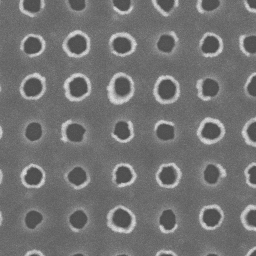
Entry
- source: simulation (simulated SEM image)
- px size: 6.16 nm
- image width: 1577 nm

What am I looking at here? a regular array of holes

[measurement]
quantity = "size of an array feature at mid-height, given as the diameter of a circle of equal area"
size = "111 nm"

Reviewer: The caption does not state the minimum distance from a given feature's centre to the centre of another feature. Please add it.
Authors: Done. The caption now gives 264 nm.